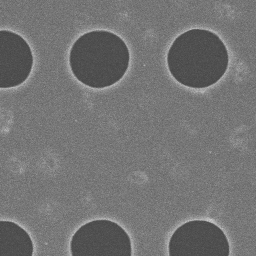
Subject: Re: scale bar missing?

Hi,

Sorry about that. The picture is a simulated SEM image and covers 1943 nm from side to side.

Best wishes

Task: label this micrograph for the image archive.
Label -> holes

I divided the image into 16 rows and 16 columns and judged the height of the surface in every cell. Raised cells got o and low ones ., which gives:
oooooooooooooooo
oooooooooooooooo
.oooo...ooo...oo
..oo....ooo...oo
..ooo...ooo...oo
oooooooooooooooo
oooooooooooooooo
oooooooooooooooo
oooooooooooooooo
oooooooooooooooo
oooooooooooooooo
oooooooooooooooo
oooooooooooooooo
oooooooooooooooo
..ooo...ooo...oo
..oo....ooo...oo